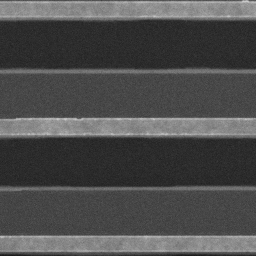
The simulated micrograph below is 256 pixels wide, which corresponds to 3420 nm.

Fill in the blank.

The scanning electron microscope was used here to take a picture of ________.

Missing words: lines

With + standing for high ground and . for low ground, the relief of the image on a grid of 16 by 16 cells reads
++++++++++++++++
................
................
................
................
++++++++++++++++
++++++++++++++++
++++++++++++++++
................
................
................
................
++++++++++++++++
++++++++++++++++
++++++++++++++++
++++++++++++++++